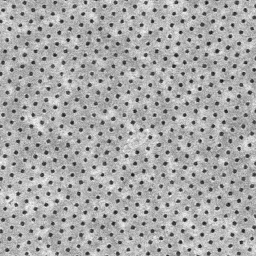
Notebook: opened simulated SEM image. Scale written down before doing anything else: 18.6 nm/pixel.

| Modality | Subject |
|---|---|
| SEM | a regular array of holes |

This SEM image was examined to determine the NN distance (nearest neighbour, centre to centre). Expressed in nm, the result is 207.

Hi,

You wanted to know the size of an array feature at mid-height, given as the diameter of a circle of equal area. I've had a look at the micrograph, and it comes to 83.8 nm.